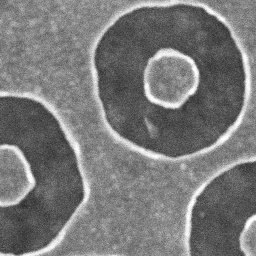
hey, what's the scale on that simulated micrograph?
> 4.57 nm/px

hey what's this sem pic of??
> ring-shaped grooves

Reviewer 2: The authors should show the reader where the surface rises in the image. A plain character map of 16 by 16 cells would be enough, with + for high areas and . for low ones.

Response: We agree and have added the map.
+++++++++....+++
+++++++.......++
++++++.........+
++++++....++...+
++++++...+++...+
++++++...+++...+
...+++....+....+
....+++........+
....+++.......++
+....++++...++++
++...+++++++++..
++...++++++++...
+....+++++++....
.....+++++++....
....++++++++...+
...+++++++++...+